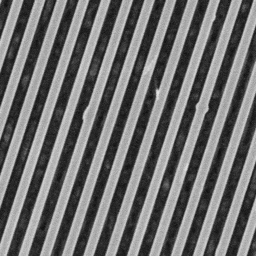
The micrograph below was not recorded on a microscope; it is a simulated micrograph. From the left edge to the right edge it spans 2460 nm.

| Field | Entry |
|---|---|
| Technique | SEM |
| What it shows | parallel lines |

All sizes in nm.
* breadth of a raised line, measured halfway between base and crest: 91.5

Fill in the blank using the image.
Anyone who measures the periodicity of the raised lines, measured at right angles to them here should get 200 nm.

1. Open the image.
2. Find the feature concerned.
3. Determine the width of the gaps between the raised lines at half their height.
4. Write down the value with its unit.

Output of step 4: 110 nm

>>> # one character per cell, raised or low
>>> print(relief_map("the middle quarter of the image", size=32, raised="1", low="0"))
10001100011100011000111000110001
00001100011000011000110001110001
00011100011000111000110001110001
00011000111000110001110001100011
00011000110001110001100011100011
00111000110001110001100011100011
00110001110001100011100011000111
00110001100011100011000111000110
01110001100011100011000111000110
01100011100011000111000110001110
01100011100111000110001110001100
11100111000111000110001110001100
11000111000110001110001100011100
11000111000110001100011100011000
11000110001110001100011100011000
10001110001100011100011000111000
10001110001100011100011000110001
10001100011100011000111000110001
00011100011000111000110001110001
00011100011000111000110001110001
00011000111000110001110001100011
00111000110001110001100011100011
00111000110001110001100011100011
00110001110001100011100011000111
01110001100011100011000111000110
01110001100011100011000111000110
01100011100011000111000110001110
01100011000111000110001110001100
11100011000111000110001110001100
11100111000110001110001100011100
11000111000110001100011100011000
11000110001110001100011100011000